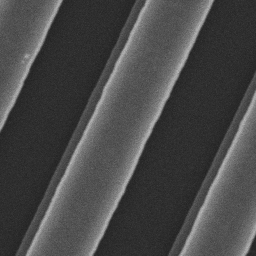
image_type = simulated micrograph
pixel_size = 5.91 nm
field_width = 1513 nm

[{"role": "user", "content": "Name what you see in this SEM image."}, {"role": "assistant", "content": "lines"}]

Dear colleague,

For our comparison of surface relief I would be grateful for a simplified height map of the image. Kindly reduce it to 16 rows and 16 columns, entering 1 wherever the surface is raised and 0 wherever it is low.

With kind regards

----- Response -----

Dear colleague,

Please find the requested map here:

1111000001111000
1110000011111000
1110000011110000
1100000111110000
1100000111100000
1000000111100000
1000001111000000
0000001111000001
0000011110000001
0000011110000011
0000111100000011
0000111100000111
0001111100000111
0001111000001111
0011111000001111
0011110000011111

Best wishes